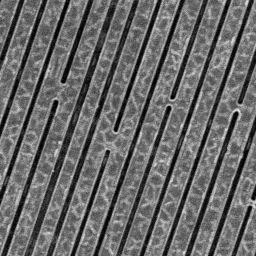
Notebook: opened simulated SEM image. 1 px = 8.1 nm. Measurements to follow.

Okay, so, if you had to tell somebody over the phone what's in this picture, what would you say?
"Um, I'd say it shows parallel lines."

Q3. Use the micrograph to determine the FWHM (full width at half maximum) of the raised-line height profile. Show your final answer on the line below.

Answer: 126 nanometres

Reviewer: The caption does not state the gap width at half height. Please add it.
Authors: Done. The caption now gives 47.9 nm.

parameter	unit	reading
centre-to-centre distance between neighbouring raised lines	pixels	21.8